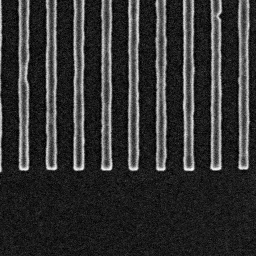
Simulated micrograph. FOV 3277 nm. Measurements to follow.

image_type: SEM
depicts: parallel lines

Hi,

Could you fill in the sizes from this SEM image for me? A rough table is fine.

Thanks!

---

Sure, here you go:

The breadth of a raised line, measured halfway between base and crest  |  0.118 µm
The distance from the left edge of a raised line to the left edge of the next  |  352 nanometres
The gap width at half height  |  0.237 microns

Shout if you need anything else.